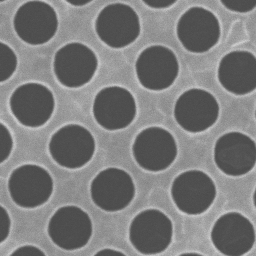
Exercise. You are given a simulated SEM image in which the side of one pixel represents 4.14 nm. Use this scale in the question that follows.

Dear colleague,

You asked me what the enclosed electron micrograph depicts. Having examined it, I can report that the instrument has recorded a regular array of holes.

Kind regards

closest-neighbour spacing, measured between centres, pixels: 57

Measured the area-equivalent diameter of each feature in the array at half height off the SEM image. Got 181 nm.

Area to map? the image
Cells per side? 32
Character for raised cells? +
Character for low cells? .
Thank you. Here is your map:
+++...+++..+++.+++....++++++....
++.....++++++....++++++...++++.+
++.....+++++.....+++++.....+++++
++.....+++++.....+++++.....+++++
++.....+++++.....+++++.....+++++
++++.++++.+++...+++++++....+++++
..+++++.....++++++....++..+++..+
..+++++.....+++++.....++++++....
..+++++.....+++++.....+++++.....
.++++++.....+++++.....+++++.....
+++..+++...+++++++...+++++++....
++....++++++....+++++++...+++..+
+......+++++.....+++++.....+++++
+......+++++.....+++++.....+++++
++....++++++.....+++++.....+++++
+++..+++++++....++++++.....+++++
.++++++....+++++++...+++++++++++
..++++......+++++.....+++++.....
..++++......+++++.....+++++.....
.++++++.....+++++.....+++++.....
+++++++....++++++....++++++.....
++....+++++++...+++++++..+++...+
+......+++++....++++++....++++++
+......++++......++++......+++++
+.....+++++......+++++.....+++++
++...+++++++....++++++....++++++
.++++++....+++++++..+++..+++++++
.+++++.....++++++....++++++....+
.+++++.....+++++......+++++.....
.+++++.....+++++.....+++++......
+++++++....++++++....++++++.....
++...+++++++...+++..++++++++...+